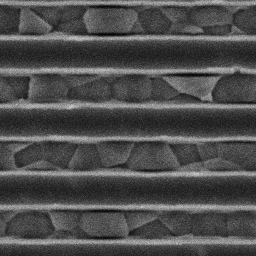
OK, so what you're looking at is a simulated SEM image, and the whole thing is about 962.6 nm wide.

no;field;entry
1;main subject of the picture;one or a few lines or trenches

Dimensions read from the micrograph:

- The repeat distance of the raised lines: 256 nm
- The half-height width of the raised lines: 130 nanometers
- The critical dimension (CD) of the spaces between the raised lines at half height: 126 nm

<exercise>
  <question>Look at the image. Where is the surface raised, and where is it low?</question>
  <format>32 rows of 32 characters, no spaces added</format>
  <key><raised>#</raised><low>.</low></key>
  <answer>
....###........#......##........
................................
................................
................................
.........#......................
################################
################################
################################
################################
................................
................................
................................
................................
################################
################################
################################
################################
................................
................................
................................
................................
................................
################################
################################
################################
################################
................................
................................
................................
................................
################################
################################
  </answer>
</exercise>